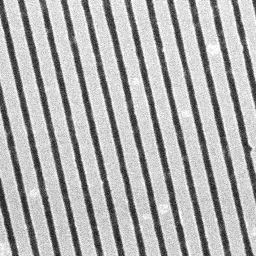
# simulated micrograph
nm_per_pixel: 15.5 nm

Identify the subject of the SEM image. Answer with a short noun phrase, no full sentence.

parallel lines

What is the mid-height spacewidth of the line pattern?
7.32 pixels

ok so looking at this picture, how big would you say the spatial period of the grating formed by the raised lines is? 322 nm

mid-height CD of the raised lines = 13.4 px